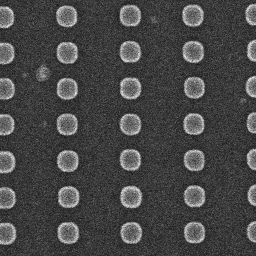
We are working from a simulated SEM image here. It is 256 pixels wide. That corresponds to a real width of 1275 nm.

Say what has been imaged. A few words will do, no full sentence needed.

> a regular array of raised bodies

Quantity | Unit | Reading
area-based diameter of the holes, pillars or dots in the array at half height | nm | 102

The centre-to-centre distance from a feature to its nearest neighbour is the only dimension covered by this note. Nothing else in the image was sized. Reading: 179 nanometers